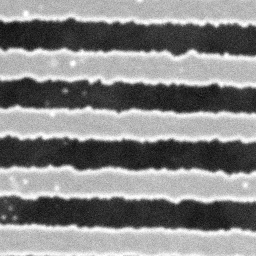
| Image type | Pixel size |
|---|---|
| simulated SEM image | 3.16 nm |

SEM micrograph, lines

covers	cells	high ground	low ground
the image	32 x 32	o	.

oooooooooooooooooooooooooooooooo
oooooooooooooooooooooooooooooooo
oooo.ooo..oooooooooooooooooooooo
................................
................................
................................
ooooooooo.o.o.oooo.oo...o.......
oooooooooooooooooooooooooooooooo
oooooooooooooooooooooooooooooooo
oooooooooooooooooooooooooooooooo
......................oooo.ooooo
................................
................................
.oo.............................
oooooooooooooooooooooooooooooooo
oooooooooooooooooooooooooooooooo
oooooooooooooooooooooooooooooooo
..........o..oo..ooo..ooooooo.oo
................................
................................
................................
oooooooooooooooooooooooooo.o....
oooooooooooooooooooooooooooooooo
oooooooooooooooooooooooooooooooo
..ooo.oooooooooooooooooooooooooo
................................
................................
................................
oooooooooo..o...................
oooooooooooooooooooooooooooooooo
oooooooooooooooooooooooooooooooo
oooooooooooooooooooooooooooooooo